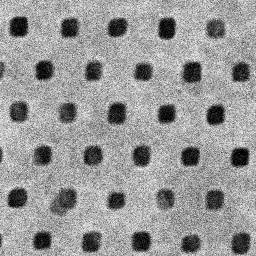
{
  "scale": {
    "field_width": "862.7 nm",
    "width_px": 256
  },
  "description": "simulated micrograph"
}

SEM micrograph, a regular array of holes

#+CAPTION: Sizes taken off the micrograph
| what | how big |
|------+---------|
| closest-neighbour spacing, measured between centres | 163 nm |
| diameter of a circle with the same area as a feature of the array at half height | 72.3 nm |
